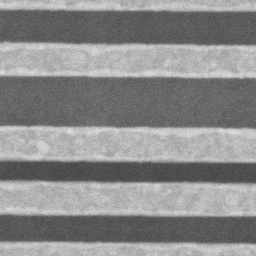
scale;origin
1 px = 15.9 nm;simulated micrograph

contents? lines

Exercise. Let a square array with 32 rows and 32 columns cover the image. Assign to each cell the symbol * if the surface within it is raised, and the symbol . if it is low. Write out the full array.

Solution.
********************************
................................
................................
................................
................................
................................
********************************
********************************
********************************
......................**********
................................
................................
................................
................................
................................
................................
********************************
********************************
********************************
********************************
................................
................................
................................
********************************
********************************
********************************
********************************
................................
................................
................................
**********..**..................
********************************